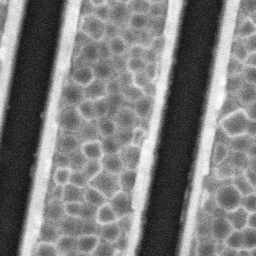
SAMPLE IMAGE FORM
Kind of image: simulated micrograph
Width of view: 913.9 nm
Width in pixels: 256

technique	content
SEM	one or a few lines or trenches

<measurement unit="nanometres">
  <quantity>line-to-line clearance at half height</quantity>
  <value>190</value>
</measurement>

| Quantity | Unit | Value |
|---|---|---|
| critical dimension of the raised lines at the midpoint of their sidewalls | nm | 366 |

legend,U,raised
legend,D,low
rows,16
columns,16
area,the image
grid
UDDDUUUUUUUDDDUU
UDDDUUUUUUUDDDUU
UDDDUUUUUUUDDDUU
DDDDUUUUUUDDDDUU
DDDDUUUUUUDDDDUU
DDDDUUUUUUDDDDUU
DDDUUUUUUUDDDUUU
DDDUUUUUUUDDDUUU
DDDUUUUUUDDDDUUU
DDDUUUUUUDDDDUUU
DDDUUUUUUDDDDUUU
DDUUUUUUUDDDUUUU
DDUUUUUUUDDDUUUU
DDUUUUUUUDDDUUUU
DDUUUUUUDDDDUUUU
DDUUUUUUDDDDUUUU